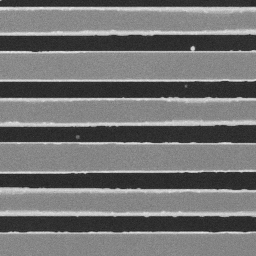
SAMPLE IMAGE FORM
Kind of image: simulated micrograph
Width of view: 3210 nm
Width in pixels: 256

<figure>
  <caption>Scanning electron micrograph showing lines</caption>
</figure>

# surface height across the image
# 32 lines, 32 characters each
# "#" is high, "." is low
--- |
................................
################################
################################
################################
................................
................................
####..##########################
################################
################################
################################
................................
................................
################################
################################
################################
##############################..
................................
................................
################################
################################
################################
#########################.......
................................
................................
################################
################################
################################
................................
................................
################################
################################
################################